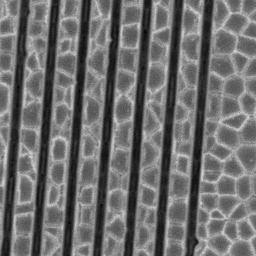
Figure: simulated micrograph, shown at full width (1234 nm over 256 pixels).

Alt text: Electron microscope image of parallel lines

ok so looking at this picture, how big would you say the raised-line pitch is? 0.147 um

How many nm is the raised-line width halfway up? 103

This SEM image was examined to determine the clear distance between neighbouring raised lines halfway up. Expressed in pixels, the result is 8.96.